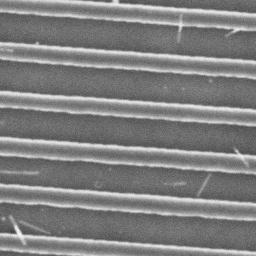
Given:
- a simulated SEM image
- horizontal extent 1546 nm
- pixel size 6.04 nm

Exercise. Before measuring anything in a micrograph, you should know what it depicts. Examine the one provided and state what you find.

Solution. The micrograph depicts lines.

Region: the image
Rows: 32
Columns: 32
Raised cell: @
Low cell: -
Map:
@@@@@@@@@@@@@@@-----------------
-@@@@@@@@@@@@@@@@@@@@@@@@@@@@---
--------------@@@@@@@@@@@@@@@@@@
----------------------------@@@@
--------------------------------
@@------------------------------
@@@@@@@@@@@@@@@-----------------
--@@@@@@@@@@@@@@@@@@@@@@@@@@@---
---------------@@@@@@@@@@@@@@@@@
-----------------------------@@@
--------------------------------
@@------------------------------
@@@@@@@@@@@@@@@-----------------
---@@@@@@@@@@@@@@@@@@@@@@@@@@---
---------------@@@@@@@@@@@@@@@@@
-----------------------------@@@
--------------------------------
@@@@----------------------------
@@@@@@@@@@@@@@@@@@--------------
--@@@@@@@@@@@@@@@@@@@@@@@@@@@@@-
----------------@@@@@@@@@@@@@@@@
----------------------------@@@@
--------------------------------
@@@@@@--------------------------
@@@@@@@@@@@@@@@@@@@-------------
------@@@@@@@@@@@@@@@@@@@@@@@@@@
------------------@@@@@@@@@@@@@@
--------------------------------
--------------------------------
@@@@----------------------------
@@@@@@@@@@@@@@@@@@--------------
---@@@@@@@@@@@@@@@@@@@@@@@@@@@@-